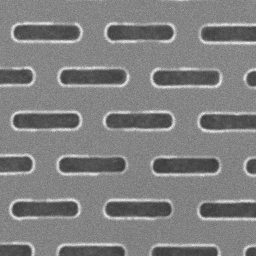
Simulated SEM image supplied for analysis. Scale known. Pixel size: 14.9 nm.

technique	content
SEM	a regular array of holes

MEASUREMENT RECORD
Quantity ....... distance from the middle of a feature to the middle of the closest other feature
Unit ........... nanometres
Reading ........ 950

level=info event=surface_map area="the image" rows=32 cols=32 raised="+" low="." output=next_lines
++++++++++++++++++++++++++++++++
++++++++++++++++++++++++++++++++
++++++++++++++++++++++++++++++++
++........+++.........+++.......
++........+++.........+++.......
++++++++++++++++++++++++++++++++
++++++++++++++++++++++++++++++++
++++++++++++++++++++++++++++++++
.+++++++++++++++++++++++++++++++
....++++........+++........++++.
....++++.......++++........++++.
++++++++++++++++++++++++++++++++
++++++++++++++++++++++++++++++++
++++++++++++++++++++++++++++++++
++........+++........++++.......
++........+++.........+++.......
++++++++++++++++++++++++++++++++
++++++++++++++++++++++++++++++++
++++++++++++++++++++++++++++++++
++.+++++++++++++++++++++++++++++
....+++.........+++........++++.
...+++++.......++++........++++.
++++++++++++++++++++++++++++++++
++++++++++++++++++++++++++++++++
++++++++++++++++++++++++++++++++
++........+++........++++.......
+.........+++........++++.......
++++++++++++++++++++++++++++++++
++++++++++++++++++++++++++++++++
++++++++++++++++++++++++++++++++
.+++++++++++++++++++++++++++++++
....+++.........+++........++++.